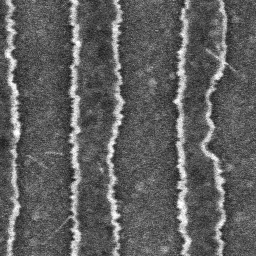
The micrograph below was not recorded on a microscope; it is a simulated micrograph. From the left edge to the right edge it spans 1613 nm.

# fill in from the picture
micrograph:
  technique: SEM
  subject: one or a few lines or trenches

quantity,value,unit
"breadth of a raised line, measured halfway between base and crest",0.261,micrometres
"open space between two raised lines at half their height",0.386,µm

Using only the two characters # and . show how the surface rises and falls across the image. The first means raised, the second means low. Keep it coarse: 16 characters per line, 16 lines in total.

#....##....###..
#....##....###..
#....##....###..
#....##....###..
#....##....###..
#...###....##...
#....###...##...
#....##....##...
#....##....##...
#....##....##...
#....##....###..
#....##....###..
#....##....###..
#....##....###..
#....##....###..
#....##.....##..